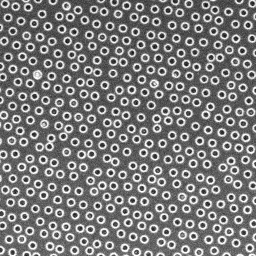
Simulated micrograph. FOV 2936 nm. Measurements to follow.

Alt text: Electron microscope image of a regular array of holes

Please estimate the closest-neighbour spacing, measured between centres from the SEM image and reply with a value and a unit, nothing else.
0.134 um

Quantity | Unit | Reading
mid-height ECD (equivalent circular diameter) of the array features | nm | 67.2